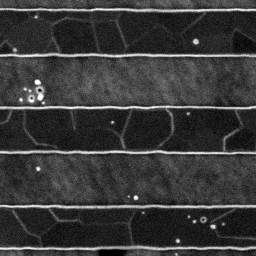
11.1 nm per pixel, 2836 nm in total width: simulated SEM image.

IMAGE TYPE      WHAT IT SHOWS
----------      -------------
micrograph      wiring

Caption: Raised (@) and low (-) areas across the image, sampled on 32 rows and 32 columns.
--------------------------------
@@@@@@@@@@@@@@@@@@@@@@@@@@@@@@@@
@@@@@@@@@@@@@@@@@@@@@@@@@@@@@@@@
@@@@@@@@@@@@@@@@@@@@@@@@@@@@@@@@
@@@@@@@@@@@@@@@@@@@@@@@@@@@@@@@@
@@@@@@@@@@@@@@@@@@@@@@@@@@@@@@@@
@@@@@@@@@@@@@@@@@@@@@@@@@@@@@@@@
--------------------------------
--------------------------------
--------------------------------
--------------------------------
--------------------------------
--------------------------------
@----@@@@@@-@@@-@@@@@@@@@@@@---@
@@@@@@@@@@@@@@@@@@@@@@@@@@@@@@@@
@@@@@@@@@@@@@@@@@@@@@@@@@@@@@@@@
@@@@@@@@@@@@@@@@@@@@@@@@@@@@@@@@
@@@@@@@@@@@@@@@@@@@@@@@@@@@@@@@@
@@@@@@@@@@@@@@@@@@@@@@@@@@@@@@@@
--------------------------------
--------------------------------
--------------------------------
--------------------------------
--------------------------------
--------------------------------
--------------------------------
@@@@@@@@@@@@@@@@@@@@@@@@@@@@@@@@
@@@@@@@@@@@@@@@@@@@@@@@@@@@@@@@@
@@@@@@@@@@@@@@@@@@@@@@@@@@@@@@@@
@@@@@@@@@@@@@@@@@@@@@@@@@@@@@@@@
@@@@@@@@@@@@@@@@@@@@@@@@@@@@@@@@
--------------------------------